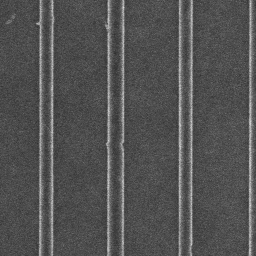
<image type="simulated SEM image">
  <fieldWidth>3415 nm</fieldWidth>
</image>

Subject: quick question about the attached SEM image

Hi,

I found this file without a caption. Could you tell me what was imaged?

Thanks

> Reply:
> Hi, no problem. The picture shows one or a few lines or trenches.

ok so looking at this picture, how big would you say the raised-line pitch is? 930 nm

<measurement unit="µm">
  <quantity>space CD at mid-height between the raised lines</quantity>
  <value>0.757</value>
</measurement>